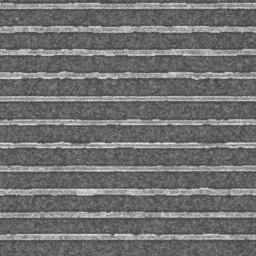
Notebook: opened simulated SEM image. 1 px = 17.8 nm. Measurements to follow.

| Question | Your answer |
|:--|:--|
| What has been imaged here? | parallel lines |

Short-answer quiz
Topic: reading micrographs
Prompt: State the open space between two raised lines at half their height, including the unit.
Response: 19.3 px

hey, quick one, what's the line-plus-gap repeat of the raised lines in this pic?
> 410 nm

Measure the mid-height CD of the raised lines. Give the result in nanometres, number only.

84.3